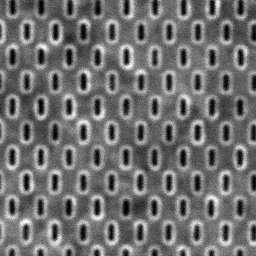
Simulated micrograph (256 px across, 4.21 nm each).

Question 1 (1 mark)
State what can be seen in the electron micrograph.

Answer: a regular array of holes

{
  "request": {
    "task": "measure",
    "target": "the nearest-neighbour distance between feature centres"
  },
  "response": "120 nm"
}